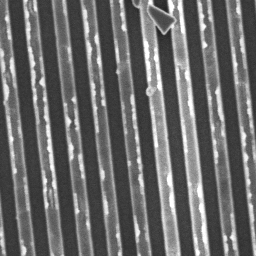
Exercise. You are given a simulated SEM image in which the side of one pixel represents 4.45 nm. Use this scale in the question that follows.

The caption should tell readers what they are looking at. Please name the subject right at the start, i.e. parallel lines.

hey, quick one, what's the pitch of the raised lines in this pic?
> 28.9 pixels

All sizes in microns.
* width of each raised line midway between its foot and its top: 0.0597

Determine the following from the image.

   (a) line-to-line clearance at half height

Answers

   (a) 69.1 nm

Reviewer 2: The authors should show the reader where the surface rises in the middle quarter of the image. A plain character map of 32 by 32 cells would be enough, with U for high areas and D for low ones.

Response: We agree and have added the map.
UUDDDDUUUDDDDUUUDDDDDUUUDDDDUUUD
UUDDDDUUUDDDDUUUUDDDDUUUDDDDUUUD
UUDDDDUUUUDDDUUUUDDDDUUUDDDDUUUD
UUDDDDUUUUDDDDUUUDDDDUUUDDDDUUUD
UUDDDDUUUUDDDDUUUDDDDUUUDDDDUUUU
UUUDDDDUUUDDDDUUUDDDDUUUDDDDUUUU
UUUDDDDUUUDDDDUUUDDDDUUUDDDDDUUU
UUUDDDDUUUDDDDUUUDDDDUUUDDDDDUUU
UUUDDDDUUUDDDDUUUDDDDUUUDDDDDUUU
UUUDDDDUUUDDDDUUUUDDDDUUUDDDDUUU
UUUDDDDUUUDDDDUUUUDDDDUUUDDDDUUU
UUUDDDDUUUDDDDDUUUDDDDUUUDDDDUUU
UUUDDDDDUUUDDDDUUUDDDDUUUDDDDUUU
UUUDDDDDUUUDDDDUUUDDDDUUUDDDDUUU
DUUUDDDDUUUDDDDUUUDDDDUUUDDDDUUU
DUUUDDDDUUUDDDDUUUDDDDUUUDDDDDUU
DUUUDDDDUUUDDDDUUUDDDDUUUUDDDDUU
DUUUDDDDUUUDDDDUUUDDDDUUUUDDDDUU
DUUUDDDDUUUDDDDUUUUDDDDUUUDDDDUU
DUUUDDDDUUUDDDDUUUUDDDDUUUDDDDUU
DUUUDDDDUUUDDDDDUUUDDDDUUUDDDDUU
DUUUDDDDDUUUDDDDUUUDDDDUUUDDDDUU
DUUUDDDDDUUUDDDDUUUDDDDUUUDDDDUU
DUUUDDDDDUUUDDDDUUUDDDDUUUDDDDUU
DUUUUDDDDUUUDDDDUUUDDDDUUUDDDDDU
DUUUUDDDDUUUDDDDUUUDDDDUUUDDDDDU
DDUUUDDDDUUUDDDDUUUDDDDUUUUDDDDU
DDUUUDDDDUUUDDDDUUUUDDDDUUUDDDDU
DDUUUDDDDUUUDDDDUUUUDDDDUUUDDDDU
DDUUUDDDDUUUDDDDUUUUDDDDUUUDDDDU
DDUUUDDDDDUUUDDDDUUUDDDDUUUDDDDU
DDUUUDDDDDUUUDDDDUUUDDDDUUUDDDDU